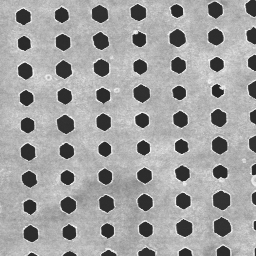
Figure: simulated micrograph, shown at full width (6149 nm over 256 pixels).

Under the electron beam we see a regular array of holes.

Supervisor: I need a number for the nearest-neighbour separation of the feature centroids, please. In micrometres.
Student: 0.646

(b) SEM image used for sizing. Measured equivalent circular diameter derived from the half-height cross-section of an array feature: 370 nanometers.